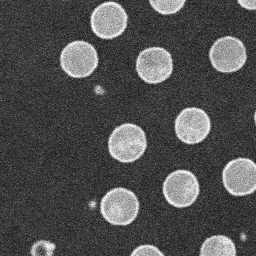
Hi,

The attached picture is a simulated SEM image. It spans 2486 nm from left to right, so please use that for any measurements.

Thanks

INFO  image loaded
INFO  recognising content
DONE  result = a regular array of raised bodies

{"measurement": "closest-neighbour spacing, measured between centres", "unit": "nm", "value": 619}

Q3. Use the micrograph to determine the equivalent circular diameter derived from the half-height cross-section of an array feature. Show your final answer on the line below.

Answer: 340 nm